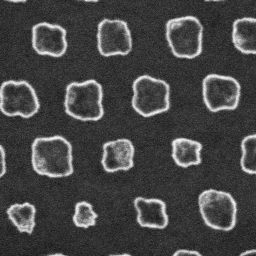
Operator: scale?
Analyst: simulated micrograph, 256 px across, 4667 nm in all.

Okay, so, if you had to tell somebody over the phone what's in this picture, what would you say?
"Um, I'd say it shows a regular array of raised bodies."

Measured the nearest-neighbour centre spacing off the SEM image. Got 1190 nanometres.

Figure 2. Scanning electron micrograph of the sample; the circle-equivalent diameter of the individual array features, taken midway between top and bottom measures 648 nm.